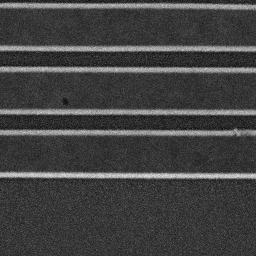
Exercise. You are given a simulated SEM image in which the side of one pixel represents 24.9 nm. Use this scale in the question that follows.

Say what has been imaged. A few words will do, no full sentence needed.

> one or a few lines or trenches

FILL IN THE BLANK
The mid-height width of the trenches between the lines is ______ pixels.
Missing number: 20.9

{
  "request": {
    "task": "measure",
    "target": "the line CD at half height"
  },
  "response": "1.06 µm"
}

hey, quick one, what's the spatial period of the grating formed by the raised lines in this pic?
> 1580 nm